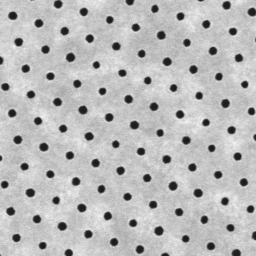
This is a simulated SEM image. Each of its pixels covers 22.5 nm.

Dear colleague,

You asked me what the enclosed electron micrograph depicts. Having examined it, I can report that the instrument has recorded a regular array of holes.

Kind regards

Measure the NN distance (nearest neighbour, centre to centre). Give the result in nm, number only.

598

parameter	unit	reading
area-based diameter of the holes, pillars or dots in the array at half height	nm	198